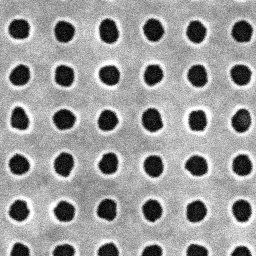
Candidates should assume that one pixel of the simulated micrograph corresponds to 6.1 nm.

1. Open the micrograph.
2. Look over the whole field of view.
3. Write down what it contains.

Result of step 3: a regular array of holes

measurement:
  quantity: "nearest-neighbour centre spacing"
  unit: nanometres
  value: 266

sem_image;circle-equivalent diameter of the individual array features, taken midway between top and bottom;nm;143